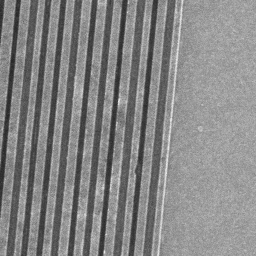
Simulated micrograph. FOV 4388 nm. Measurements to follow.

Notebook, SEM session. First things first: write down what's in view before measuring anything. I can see parallel lines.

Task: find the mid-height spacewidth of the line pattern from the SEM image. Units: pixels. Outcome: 6.97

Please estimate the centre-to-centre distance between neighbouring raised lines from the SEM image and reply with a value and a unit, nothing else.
262 nanometers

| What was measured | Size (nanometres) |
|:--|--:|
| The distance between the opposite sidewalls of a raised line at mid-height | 147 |